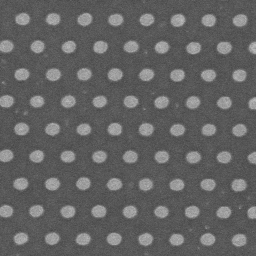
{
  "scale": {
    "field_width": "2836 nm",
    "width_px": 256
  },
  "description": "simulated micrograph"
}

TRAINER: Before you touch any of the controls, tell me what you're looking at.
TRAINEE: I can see a regular array of raised bodies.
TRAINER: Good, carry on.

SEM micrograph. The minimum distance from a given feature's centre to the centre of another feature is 342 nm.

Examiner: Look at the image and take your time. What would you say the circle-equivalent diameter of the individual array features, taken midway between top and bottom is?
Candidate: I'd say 148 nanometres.